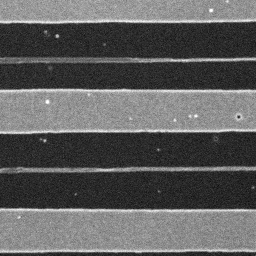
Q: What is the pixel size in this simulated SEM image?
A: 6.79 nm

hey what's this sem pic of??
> lines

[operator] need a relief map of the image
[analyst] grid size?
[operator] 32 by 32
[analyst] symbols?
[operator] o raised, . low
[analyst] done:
oooooooooooooooooooooooooooooooo
oooooooooooooooooooooooooooooooo
oooooooooooooooooooooooooooooooo
................................
................................
................................
................................
................................
................................
................................
................................
oooooooooooooooooooooooooooooooo
oooooooooooooooooooooooooooooooo
oooooooooooooooooooooooooooooooo
oooooooooooooooooooooooooooooooo
oooooooooooooooooooooooooooooooo
oooooooo........................
................................
................................
................................
................................
................................
................................
................................
................................
................................
oooooooooooooooooooooooooooooooo
oooooooooooooooooooooooooooooooo
oooooooooooooooooooooooooooooooo
oooooooooooooooooooooooooooooooo
oooooooooooooooooooooooooooooooo
oo.o............................